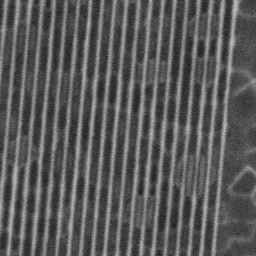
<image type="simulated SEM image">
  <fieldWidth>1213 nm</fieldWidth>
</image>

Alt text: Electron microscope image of parallel lines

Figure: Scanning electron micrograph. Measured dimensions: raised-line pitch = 56.9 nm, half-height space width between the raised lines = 44.9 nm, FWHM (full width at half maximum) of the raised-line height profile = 11.8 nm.